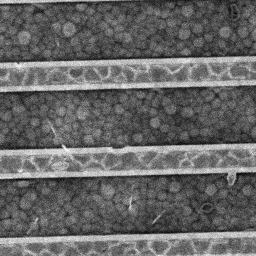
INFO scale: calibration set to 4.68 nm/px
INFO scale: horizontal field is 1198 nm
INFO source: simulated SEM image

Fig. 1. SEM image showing one or a few lines or trenches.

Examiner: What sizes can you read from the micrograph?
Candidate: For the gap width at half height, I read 294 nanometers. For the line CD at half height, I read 0.113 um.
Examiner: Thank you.